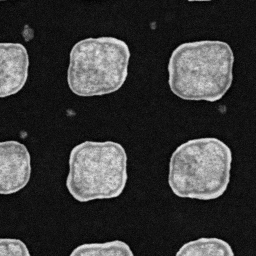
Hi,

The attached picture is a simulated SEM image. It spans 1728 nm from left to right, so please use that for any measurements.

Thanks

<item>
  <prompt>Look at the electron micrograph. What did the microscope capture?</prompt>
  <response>raised bodies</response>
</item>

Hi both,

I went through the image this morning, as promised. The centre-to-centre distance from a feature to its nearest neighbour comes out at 681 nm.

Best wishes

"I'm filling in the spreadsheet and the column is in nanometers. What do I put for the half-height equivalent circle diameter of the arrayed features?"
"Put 415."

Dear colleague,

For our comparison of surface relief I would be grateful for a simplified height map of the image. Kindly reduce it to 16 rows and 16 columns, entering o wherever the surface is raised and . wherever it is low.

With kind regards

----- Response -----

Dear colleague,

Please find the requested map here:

................
................
.....oo.........
oo..oooo...oooo.
oo..oooo...ooo..
o...ooo....ooo..
................
................
................
oo...ooo...ooo..
oo..oooo...ooo..
oo..oooo...ooo..
................
................
................
oo...ooo...ooo..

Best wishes